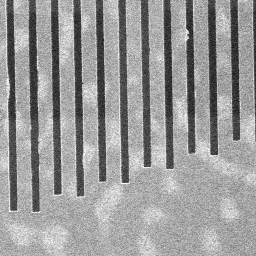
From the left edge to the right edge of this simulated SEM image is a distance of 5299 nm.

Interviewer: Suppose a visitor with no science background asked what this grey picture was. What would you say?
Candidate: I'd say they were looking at parallel lines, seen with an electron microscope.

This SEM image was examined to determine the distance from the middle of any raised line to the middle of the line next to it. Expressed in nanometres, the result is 464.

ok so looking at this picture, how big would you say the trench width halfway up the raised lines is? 166 nanometers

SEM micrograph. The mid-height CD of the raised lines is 300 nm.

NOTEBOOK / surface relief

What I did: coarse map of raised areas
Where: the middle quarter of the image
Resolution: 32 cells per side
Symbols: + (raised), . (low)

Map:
++...+++..++++..+++...+++..++++.
++...+++..++++..+++...+++..++++.
++...+++..++++..+++...+++..++++.
++...+++..++++..+++...+++..++++.
++...+++..++++..+++...+++..+++..
+++..++...++++..+++...+++..++++.
+++..++...++++..+++...+++..++++.
+++..+++..++++..+++...+++..++++.
+++..+++..++++..+++...+++..++++.
+++..+++..++++..+++...+++..++++.
+++..+++..++++..+++...+++..++++.
+++..+++..++++..+++...+++..++++.
+++..+++..++++..++++..+++..++++.
+++..+++...+++..++++..+++..++++.
+++..+++...+++..++++..+++..++++.
+++..+++...+++..++++..+++..++++.
+++..+++...+++..++++..+++..++++.
+++..+++...+++..++++..+++..++++.
+++..+++...+++..++++..+++..++++.
+++..+++...+++..++++..+++..++++.
+++..+++...+++..++++..+++...+++.
+++..+++...+++..++++..+++...+++.
+++..+++...+++..++++...++...+++.
+++..+++...+++..++++..+++...++++
+++..+++...+++..++++..+++...++++
+++..+++...+++..++++..+++...++++
+++..++++..+++..++++++++++++++++
+++..++++..+++..++++++++++++++++
+++..++++..+++..++++++++++++++++
+++..++++.++++..++++++++++++++++
+++..+++++++++++++++++++++++++++
+++..+++++++++++++++++++++++++++